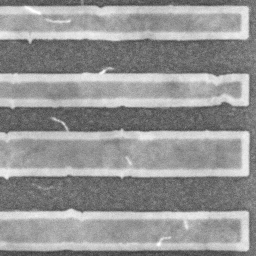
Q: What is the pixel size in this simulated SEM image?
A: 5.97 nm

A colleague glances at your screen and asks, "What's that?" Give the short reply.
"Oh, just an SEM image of one or a few lines or trenches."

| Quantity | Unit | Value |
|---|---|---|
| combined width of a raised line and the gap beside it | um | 0.414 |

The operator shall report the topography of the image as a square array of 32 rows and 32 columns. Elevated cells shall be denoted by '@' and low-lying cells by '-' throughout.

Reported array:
--------------------------------
@@@@@@@@@@@@@@@@@@@@@@@@@@@@@@@-
@@@@@@@@@@@@@@@@@@@@@@@@@@@@@@@-
@@@@@@@@@@@@@@@@@@@@@@@@@@@@@@@-
---@---------@@@------@@--------
--------------------------------
--------------------------------
--------------------------------
--------------------------------
--------------------------------
@@@@@@@@@@@@@@@@@@@@@@@@@@@@@@@-
@@@@@@@@@@@@@@@@@@@@@@@@@@@@@@@-
@@@@@@@@@@@@@@@@@@@@@@@@@@@@-@@-
--------------------------------
--------------------------------
--------------------------------
--------------------------------
@@@@@@@@@@@@@@@@@@@@@@@@@@@@@@@-
@@@@@@@@@@@@@@@@@@@@@@@@@@@@@@@-
@@@@@@@@@@@@@@@@@@@@@@@@@@@@@@@-
@@@@@@@@@@@@@@@@@@@@@@@@@@@@@@@-
@@@@@@@@@@@@@@@@@@@@@@@@@@@@@@--
--------------------------------
--------------------------------
--------------------------------
--------------------------------
--------------------------------
@@@@@@@@@@@@@@@@@@@@@@@@@@@@@@@-
@@@@@@@@@@@@@@@@@@@@@@@@@@@@@@@-
@@@@@@@@@@@@@@@@@@@@@@@@@@@@@@@-
@@@@@@@@@@@@@@@@@@@@@@@@@@@@@@@-
--------------------------------